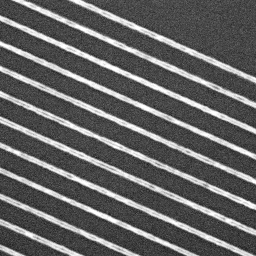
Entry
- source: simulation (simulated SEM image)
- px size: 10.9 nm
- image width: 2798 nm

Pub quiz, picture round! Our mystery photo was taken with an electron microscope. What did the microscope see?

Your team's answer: parallel lines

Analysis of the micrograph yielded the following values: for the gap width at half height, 223 nm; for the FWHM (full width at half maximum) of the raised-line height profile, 32.4 nm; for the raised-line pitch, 23.3 px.